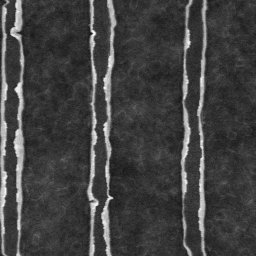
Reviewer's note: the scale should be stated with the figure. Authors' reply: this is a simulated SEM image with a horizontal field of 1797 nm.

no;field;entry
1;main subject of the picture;one or a few lines or trenches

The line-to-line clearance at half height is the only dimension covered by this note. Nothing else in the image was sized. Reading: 73.1 pixels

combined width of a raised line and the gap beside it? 0.639 µm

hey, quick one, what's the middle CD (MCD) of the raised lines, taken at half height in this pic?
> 0.126 microns